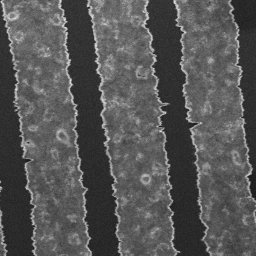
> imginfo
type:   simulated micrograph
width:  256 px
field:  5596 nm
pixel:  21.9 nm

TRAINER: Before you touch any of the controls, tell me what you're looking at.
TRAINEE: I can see one or a few lines or trenches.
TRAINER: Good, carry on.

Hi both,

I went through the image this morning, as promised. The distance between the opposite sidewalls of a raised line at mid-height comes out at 1180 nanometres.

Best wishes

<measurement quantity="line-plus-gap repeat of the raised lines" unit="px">84.4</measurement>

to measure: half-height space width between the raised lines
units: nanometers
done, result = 640